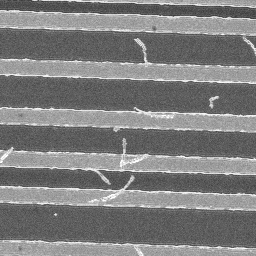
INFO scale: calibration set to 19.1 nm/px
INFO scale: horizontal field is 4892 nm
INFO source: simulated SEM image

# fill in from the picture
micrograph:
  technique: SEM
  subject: lines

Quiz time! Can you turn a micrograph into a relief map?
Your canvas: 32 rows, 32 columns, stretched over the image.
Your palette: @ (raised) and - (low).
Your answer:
--------------------@@@@@@@@@@@@
@@@@@@--------------------------
@@@@@@@@@@@@@@@@@@@@@@@@@@@@@@@@
-----@@@@@@@@@@@@@@@@@@@@@@@@@@@
--------------------------------
--------------------------------
--------------------------------
@@@@----------------------------
@@@@@@@@@@@@@@@@@@@@@@@@@@@@@@@@
-----@@@@@@@@@@@@@@@@@@@@@@@@@@@
--------------------------------
--------------------------------
--------------------------------
@@-@----------------------------
@@@@@@@@@@@@@@@@@@@@@@@@@@@@@@@@
---@@@@@@@@@@@@@@@@@@@@@@@@@@@@@
--------------------------------
--------------------------------
--------------------------------
@@@@@@@@@@@@@@@@@@@-------------
@@@@@@@@@@@@@@@@@@@@@@@@@@@@@@@@
--------------------@@@@@@@@@@@@
--------------------------------
@@@@@@--------------------------
@@@@@@@@@@@@@@@@@@@@@@@@@@@@@@@@
--------@@@@@@@@@@@@@@@@@@@@@@@@
--------------------------------
--------------------------------
--------------------------------
--------------------------------
@@@@@@@@@@@@--------------------
@@@@@@@@@@@@@@@@@@@@@@@@@@@@@@@@